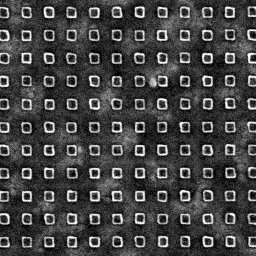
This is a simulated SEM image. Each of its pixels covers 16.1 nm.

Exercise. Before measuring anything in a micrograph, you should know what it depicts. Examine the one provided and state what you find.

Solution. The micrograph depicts a regular array of raised bodies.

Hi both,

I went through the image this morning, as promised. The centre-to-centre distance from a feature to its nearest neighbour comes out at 362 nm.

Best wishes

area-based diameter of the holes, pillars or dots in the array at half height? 10.5 px